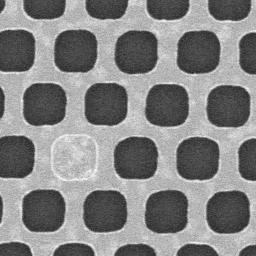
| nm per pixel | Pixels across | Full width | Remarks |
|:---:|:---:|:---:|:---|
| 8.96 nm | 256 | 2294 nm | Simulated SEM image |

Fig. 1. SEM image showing a regular array of holes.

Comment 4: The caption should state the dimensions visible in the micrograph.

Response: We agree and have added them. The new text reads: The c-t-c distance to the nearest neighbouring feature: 61.1 px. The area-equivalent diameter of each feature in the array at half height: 424 nm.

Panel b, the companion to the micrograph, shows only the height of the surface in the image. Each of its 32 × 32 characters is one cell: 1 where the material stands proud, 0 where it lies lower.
01100000110000001100000011000000
11100000111000001100000011000001
11110011111100111110001111100011
10011111111111111111111111111111
00001110000011100001111000011100
00000110000011000000110000001100
00000110000011000000110000001100
00001110000011000000110000011100
00001110000011100001110000011100
11111111111111111111111111111111
11110001111100011110001111111111
01100000111000001100000111000001
01100000110000001100000011000001
01100000110000001100000011000001
11100000110000001100000011000001
11100001111000011110000111000001
11111111111111111111111111111111
00001111111111100001111000011110
00001111111111000000110000011100
00001111111111000000110000011100
00001111111111000000110000011100
00001111111111000000110000011100
11111111111111110011111000111110
11111111111111111111111111111111
11100000111000001110000111000001
11100000110000001100000011000001
11100000110000001100000011000001
11100000110000001100000011000001
11100000111000011100000111000001
11111111111111111111111111111111
00011111000111110011111000111111
00001110000011000001110000011100